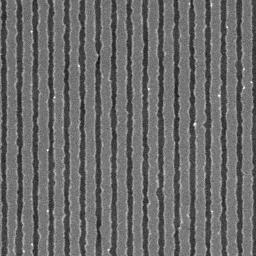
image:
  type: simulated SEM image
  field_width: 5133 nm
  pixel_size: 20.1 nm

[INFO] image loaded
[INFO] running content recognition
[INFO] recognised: parallel lines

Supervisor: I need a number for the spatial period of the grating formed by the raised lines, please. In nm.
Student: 314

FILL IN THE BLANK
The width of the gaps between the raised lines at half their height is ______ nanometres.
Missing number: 118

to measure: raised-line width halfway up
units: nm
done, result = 198